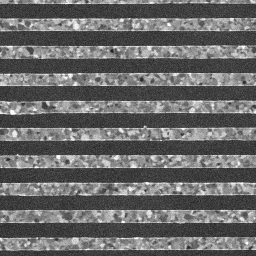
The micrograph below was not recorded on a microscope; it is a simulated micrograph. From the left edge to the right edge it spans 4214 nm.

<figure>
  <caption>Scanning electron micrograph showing parallel lines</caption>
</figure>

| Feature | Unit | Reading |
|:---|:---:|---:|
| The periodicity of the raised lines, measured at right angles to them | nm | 450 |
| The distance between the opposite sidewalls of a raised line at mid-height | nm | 195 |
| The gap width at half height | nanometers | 257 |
